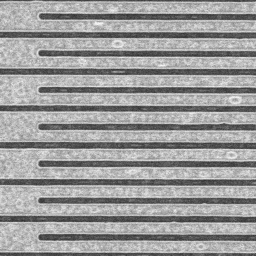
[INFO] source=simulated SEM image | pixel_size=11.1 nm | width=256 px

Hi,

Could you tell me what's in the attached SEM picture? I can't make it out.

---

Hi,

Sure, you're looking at parallel lines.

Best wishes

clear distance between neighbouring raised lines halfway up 74.7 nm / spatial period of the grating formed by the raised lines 204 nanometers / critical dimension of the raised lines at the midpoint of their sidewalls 130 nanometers